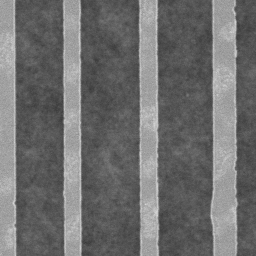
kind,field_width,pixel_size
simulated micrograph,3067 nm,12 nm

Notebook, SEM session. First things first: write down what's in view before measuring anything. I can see one or a few lines or trenches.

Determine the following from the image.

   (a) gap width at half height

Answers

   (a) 672 nanometres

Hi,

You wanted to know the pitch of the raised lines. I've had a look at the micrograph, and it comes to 909 nm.